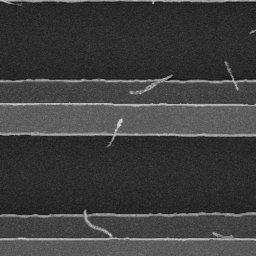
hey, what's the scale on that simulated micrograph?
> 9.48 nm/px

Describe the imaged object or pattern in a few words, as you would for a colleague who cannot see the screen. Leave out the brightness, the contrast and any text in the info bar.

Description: lines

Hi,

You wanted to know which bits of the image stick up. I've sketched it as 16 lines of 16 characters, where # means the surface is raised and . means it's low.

................
................
................
................
................
################
################
################
................
................
................
................
................
#.##############
################
################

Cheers